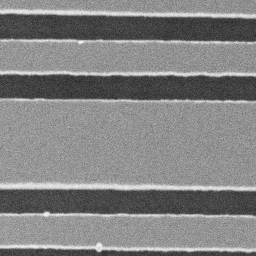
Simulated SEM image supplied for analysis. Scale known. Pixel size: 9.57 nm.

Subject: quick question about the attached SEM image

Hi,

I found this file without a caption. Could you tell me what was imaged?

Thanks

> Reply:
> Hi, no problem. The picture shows lines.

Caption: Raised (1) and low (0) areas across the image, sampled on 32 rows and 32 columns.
11111111111111111111111111111111
11111111111111111111111111111111
00000000000000000000000000000000
00000000000000000000000000000000
00000000000000000000000000000000
11111111111111111111111111111111
11111111111111111111111111111111
11111111111111111111111111111111
11111111111111111111111111111111
00000000000000000000000000000000
00000000000000000000000000000000
00000000000000000000000000000000
11111100000000000000000000000000
11111111111111111111111111111111
11111111111111111111111111111111
11111111111111111111111111111111
11111111111111111111111111111111
11111111111111111111111111111111
11111111111111111111111111111111
11111111111111111111111111111111
11111111111111111111111111111111
11111111111111111111111111111111
11111111111111111111111111111111
00000000000000111111111111111111
00000000000000000000000000000000
00000000000000000000000000000000
00000000000000000000000000000000
11111111111111111111111111111111
11111111111111111111111111111111
11111111111111111111111111111111
11111111111111111111111111111111
00000000000000000000000000000000